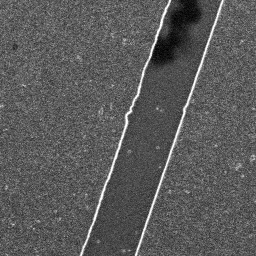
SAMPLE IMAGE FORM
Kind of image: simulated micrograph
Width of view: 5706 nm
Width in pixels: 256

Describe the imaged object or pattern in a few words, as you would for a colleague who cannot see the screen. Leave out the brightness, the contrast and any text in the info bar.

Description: one or a few lines or trenches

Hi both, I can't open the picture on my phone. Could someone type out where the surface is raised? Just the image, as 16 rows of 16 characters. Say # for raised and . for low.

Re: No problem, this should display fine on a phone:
##########....##
##########...###
##########...###
#########....###
#########...####
#########...####
########....####
########...#####
########...#####
#######....#####
#######...######
#######...######
######....######
######...#######
######...#######
#####....#######